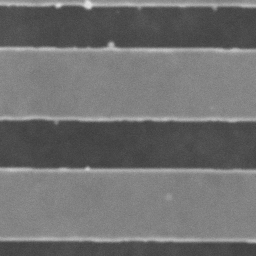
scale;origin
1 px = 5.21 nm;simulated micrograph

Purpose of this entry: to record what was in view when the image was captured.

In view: lines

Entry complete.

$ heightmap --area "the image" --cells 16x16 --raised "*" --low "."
................
................
................
****************
****************
****************
****************
....************
................
................
................
****************
****************
****************
****************
................